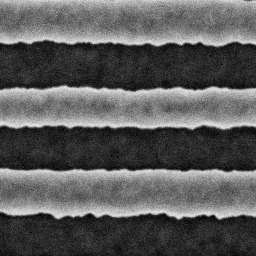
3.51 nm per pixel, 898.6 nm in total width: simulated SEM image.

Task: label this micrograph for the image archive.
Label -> lines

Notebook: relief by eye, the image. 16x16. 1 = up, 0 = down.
1111111111111111
1111111111111111
1111111111111111
0000000000000000
0000000000000000
0000000000000000
1111111111111111
1111111111111111
0000000000000000
0000000000000000
0000000000000000
1111111111111111
1111111111111111
0001000100010100
0000000000000000
0000000000000000